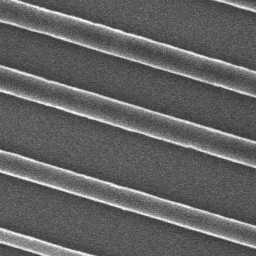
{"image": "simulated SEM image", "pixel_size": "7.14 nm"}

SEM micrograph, one or a few lines or trenches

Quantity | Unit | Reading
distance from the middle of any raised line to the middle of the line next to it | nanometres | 524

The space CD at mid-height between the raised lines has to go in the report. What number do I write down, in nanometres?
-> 398